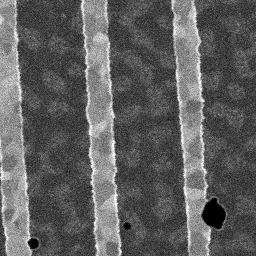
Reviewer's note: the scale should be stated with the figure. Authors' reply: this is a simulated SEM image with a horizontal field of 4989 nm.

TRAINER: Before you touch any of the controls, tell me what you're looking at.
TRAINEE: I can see one or a few lines or trenches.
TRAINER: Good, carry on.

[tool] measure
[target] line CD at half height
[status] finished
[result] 450 nm